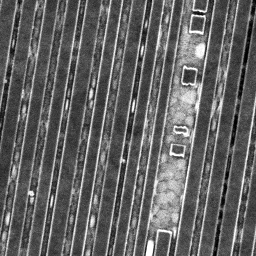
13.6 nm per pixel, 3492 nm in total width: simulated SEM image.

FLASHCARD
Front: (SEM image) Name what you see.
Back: parallel lines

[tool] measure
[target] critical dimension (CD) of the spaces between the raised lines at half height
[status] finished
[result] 108 nm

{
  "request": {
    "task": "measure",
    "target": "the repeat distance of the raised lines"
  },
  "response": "21.2 pixels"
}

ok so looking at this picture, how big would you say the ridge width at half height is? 189 nm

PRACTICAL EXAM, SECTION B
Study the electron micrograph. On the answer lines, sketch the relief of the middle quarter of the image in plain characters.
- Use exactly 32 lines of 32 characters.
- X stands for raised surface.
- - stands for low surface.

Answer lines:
X--XXXX--XXX---XXX--XXX--XX-----
X--XXXX--XXX--XXXX--XX---XX---XX
X--XXXX--XXX--XXXX-XXX---XX---XX
X--XXX---XXX--XXXX-XXX--XXX---XX
X-XXXX--XXXX--XXX--XXX--XXX---XX
X-XXXX--XXX---XXX--XXX--XXX-----
--XXXX--XXX---XXX--XXX--XX------
--XXXX--XXX--XXXX--XX---XX------
--XXXX--XXX--XXXX--XX---XX-----X
--XXX---XXX--XXXX-XXX--XXX------
--XXX---XX---XXXX-XXX--XXX------
-XXXX---XX---XXX--XXX--XXX------
-XXXX--XXX---XXX--XXX--XX-------
-XXXX--XXX--XXXX--XX---XX-------
-XXXX--XXX--XXXX--XX---XX-------
-XXXX--XXX--XXXX-XXX--XXX-------
-XXX--XXX---XXXX-XXX--XXX---XXX-
XXXX--XXX---XXX--XXX--XXX-------
XXXX--XXX---XXX--XXX--XX--------
XXXX--XXX---XXX--XXX--XX--------
XXXX--XXX--XXXX--XX---XX---XXX--
XXXX--XXX--XXXX-XXX---XX---XXX--
XXX---XX---XXXX-XXX--XXX---XXX--
XXX--XXX---XXX--XXX--XXX--------
XXX--XXX---XXX--XXX--XXX-------X
XXX--XXX---XXX--XXX--XX--------X
XXX--XXX--XXXX--XX---XX--------X
XXX--XXX--XXXX--XX---XX--------X
XX---XXX--XXXX-XXX--XXX--------X
XX--XXX---XXXX-XXX--XXX--------X
XX--XXX---XXX--XXX--XXX-------XX
XX--XXX---XXX--XXX--XX--------XX